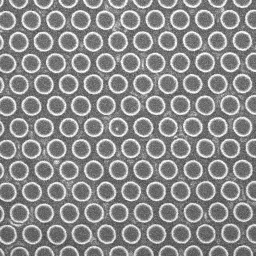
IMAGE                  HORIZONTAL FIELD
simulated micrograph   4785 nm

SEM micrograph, a regular array of raised bodies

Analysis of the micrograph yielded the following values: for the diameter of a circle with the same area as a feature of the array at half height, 0.337 micrometres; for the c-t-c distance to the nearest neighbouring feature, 0.458 µm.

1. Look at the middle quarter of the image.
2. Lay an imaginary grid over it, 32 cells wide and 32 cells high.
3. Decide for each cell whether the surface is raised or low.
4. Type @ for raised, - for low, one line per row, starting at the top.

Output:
--@@@@--@@@@@--@@@@--@@@@--@@@@-
---@@----@@@---@@@----@@----@@--
--------------------------------
@@@---@@@---@@@---@@@---@@@@--@@
@@@--@@@@--@@@@@--@@@@--@@@@--@@
@@@--@@@@--@@@@@--@@@@--@@@@--@@
@@@---@@@---@@@---@@@@---@@@---@
--------------------------------
---@@----@@@---@@@----@@----@@--
--@@@@---@@@---@@@@--@@@@--@@@@-
--@@@@---@@@@-@@@@@--@@@@--@@@@-
--@@@@---@@@---@@@@--@@@@--@@@@-
----@-----------@@--------------
--------------------------------
@@@---@@@---@@@---@@@@--@@@@--@@
@@@--@@@@---@@@@--@@@@--@@@@--@@
@@@--@@@@---@@@@--@@@@--@@@@--@@
@@@---@@@---@@@----@@----@@----@
--------------------------------
---@@@---@@@---@@@---@@@@---@@--
--@@@@---@@@---@@@@--@@@@--@@@@-
--@@@@---@@@@--@@@@--@@@@--@@@@-
---@@@---@@@---@@@---@@@@---@@@-
--------------------------------
------------@@@----@@----@@----@
@@@---@@@---@@@---@@@@--@@@@---@
@@@--@@@@@--@@@@--@@@@--@@@@--@@
@@@---@@@---@@@@--@@@@--@@@@---@
@@----@@@----@@----@@----@@-----
--------------------------------
---@@@---@@@---@@@---@@@@--@@@@-
--@@@@@--@@@@--@@@@--@@@@--@@@@-